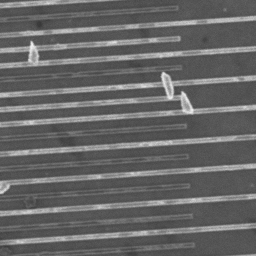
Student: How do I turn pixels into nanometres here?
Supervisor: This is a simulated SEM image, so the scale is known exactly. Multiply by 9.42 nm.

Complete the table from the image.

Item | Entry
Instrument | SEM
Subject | parallel lines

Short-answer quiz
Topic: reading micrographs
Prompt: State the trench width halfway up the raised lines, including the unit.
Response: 101 nm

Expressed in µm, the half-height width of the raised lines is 0.0341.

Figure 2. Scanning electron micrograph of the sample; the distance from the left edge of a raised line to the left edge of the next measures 0.14 µm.